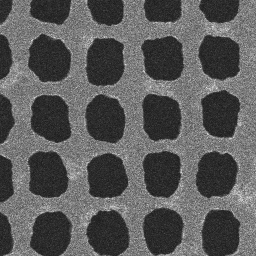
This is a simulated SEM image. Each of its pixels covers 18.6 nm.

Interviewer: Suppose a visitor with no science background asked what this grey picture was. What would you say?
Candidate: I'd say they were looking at a regular array of holes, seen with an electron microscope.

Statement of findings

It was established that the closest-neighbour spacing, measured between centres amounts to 1040 nm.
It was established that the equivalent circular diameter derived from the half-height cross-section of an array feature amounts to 0.831 µm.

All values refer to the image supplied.